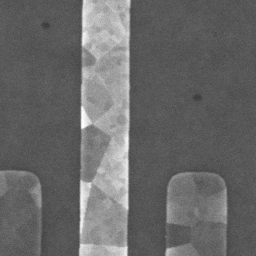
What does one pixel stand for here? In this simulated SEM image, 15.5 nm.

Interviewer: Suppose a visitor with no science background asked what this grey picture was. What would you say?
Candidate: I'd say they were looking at wiring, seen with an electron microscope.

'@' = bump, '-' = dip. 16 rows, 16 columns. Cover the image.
-----@@@--------
-----@@@--------
-----@@@--------
-----@@@--------
-----@@@--------
-----@@@--------
-----@@@--------
-----@@@--------
-----@@@--------
-----@@@--------
-----@@@--------
@@---@@@---@@@--
@@---@@@---@@@--
@@---@@@--@@@@--
@@---@@@--@@@@--
@@---@@@--@@@@--